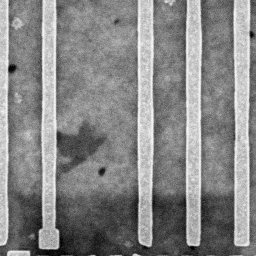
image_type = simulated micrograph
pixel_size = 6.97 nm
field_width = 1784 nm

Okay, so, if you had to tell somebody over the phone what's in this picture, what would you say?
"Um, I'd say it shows wiring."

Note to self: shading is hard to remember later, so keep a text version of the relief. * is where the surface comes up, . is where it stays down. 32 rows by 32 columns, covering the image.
*....**..........**.....*....**.
*....**..........**....**....**.
*....**..........**....**....**.
*....**..........**....**....**.
*....**..........**....**....**.
*....**..........**....**....**.
*....**..........**....**....**.
*....**..........**....**....**.
*....**..........**....**....**.
*....**..........**....**....**.
*....**..........**....**....**.
*....**..........**....**....**.
*....**..........**....**....**.
*....**..........**....**....**.
*....**..........**....**....**.
*....**..........**....**....**.
*....**..........**....**.....*.
*....**..........**....**....**.
*....**..........**....**....**.
*....**..........**....**....**.
*....**..........**....**....**.
*....**..........**....**....**.
*....**..........**....**....**.
*....**..........**....**....**.
*....**..........**....**....**.
*....**..........**....**....**.
*....**..........**....**....**.
*....**..........**....**....**.
*....**..........**....**....**.
*....**..........**....**....**.
.....**...........*.....*.....*.
.**.............................